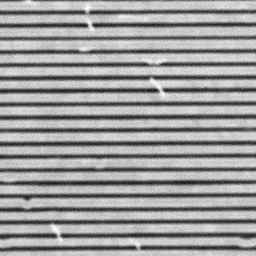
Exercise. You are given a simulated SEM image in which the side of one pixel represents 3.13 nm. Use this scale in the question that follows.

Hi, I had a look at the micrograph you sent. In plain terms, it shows parallel lines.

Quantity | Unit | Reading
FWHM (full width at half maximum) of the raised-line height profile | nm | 23.5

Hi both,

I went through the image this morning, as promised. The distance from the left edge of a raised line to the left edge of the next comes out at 41.1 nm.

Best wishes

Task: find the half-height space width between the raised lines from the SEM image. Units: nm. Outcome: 17.6